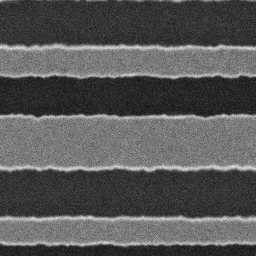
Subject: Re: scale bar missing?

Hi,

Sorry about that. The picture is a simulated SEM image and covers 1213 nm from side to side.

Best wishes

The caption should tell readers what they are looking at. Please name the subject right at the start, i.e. lines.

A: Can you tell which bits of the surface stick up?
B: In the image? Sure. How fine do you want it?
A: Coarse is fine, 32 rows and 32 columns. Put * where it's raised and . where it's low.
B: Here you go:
................................
................................
................................
................................
................................
................................
********************************
********************************
********************************
******..*********..********.**.*
................................
................................
................................
................................
****..*********..****.***..*****
********************************
********************************
********************************
********************************
********************************
********************************
................................
................................
................................
................................
................................
................................
********************************
********************************
********************************
.****.******..********.***.*....
................................